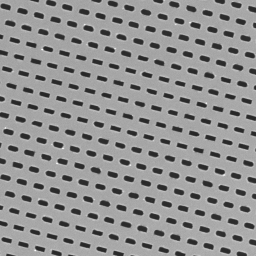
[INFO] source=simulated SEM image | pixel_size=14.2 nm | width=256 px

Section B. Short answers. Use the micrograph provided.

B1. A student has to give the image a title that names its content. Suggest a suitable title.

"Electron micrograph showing a regular array of holes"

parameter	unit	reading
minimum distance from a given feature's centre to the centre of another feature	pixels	17